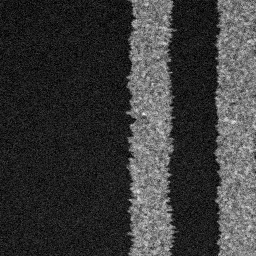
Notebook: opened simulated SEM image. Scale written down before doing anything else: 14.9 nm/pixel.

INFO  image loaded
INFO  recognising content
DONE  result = one or a few lines or trenches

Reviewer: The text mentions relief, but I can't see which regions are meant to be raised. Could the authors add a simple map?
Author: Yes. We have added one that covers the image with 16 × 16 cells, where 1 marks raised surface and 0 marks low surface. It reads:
0000000011100011
0000000011100011
0000000011100011
0000000011100011
0000000011100011
0000000011100011
0000000011100011
0000000011100011
0000000011100011
0000000011100011
0000000011000011
0000000011000011
0000000011000011
0000000011100011
0000000011100011
0000000011100011